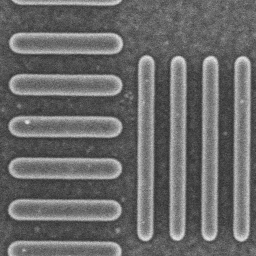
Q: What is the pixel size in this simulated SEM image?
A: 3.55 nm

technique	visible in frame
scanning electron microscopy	groups of lines, slits or small figures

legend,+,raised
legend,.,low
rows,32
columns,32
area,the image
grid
......++++++++..................
................................
................................
................................
..+++++++++++++.................
.++++++++++++++.................
..+++++++++++++.................
..................+...+...+...+.
.................++..++..++..++.
..++++++.........++..++..++..++.
.++++++++++++++..++..++..++..++.
..+++++++++++++..++..++..++..++.
.................++..++..++..++.
.................++..++..++..++.
.................++..++..++..++.
.++++++++++++++..++..++..++..++.
.++++++++++++++..++..++..++..++.
.................++..++..++..++.
.................++..++..++..++.
.................++..++..++..++.
.++++++++++++++..++..++..++..++.
.++++++++++++++..++..++..++..++.
.................++..++..++..++.
.................++..++..++..++.
.................++..++..++..++.
.++++++++++++++..++..++..++..++.
.++++++++++++++..++..++..++..++.
.................++..++..++..++.
.................++..++..++..++.
.................++..++..++..++.
..+++++++++++++.................
.++++++++++++++.................